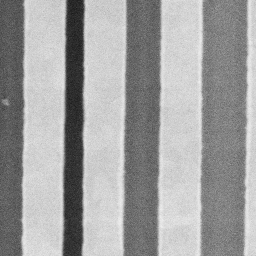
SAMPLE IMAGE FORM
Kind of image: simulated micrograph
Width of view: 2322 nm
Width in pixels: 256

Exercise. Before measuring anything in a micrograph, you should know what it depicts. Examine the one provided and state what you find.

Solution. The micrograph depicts lines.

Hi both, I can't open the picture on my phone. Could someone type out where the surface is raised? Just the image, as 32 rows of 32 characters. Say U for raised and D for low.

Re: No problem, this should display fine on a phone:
DDDUUUUUDDDUUUUUDDDDUUUUUDDDDDDU
DDDUUUUUDDDUUUUUDDDDUUUUUDDDDDDU
DDDUUUUUDDDUUUUUDDDDUUUUUDDDDDDU
DDDUUUUUDDDUUUUUDDDDUUUUUDDDDDDU
DDDUUUUUDDDUUUUUDDDDUUUUUDDDDDDU
DDDUUUUUDDDUUUUUDDDDUUUUUDDDDDDU
DDDUUUUUDDDUUUUUDDDDUUUUUDDDDDDU
DDDUUUUUDDDUUUUUDDDDUUUUUDDDDDDU
DDDUUUUUDDDUUUUUDDDDUUUUUDDDDDDU
DDDUUUUUDDDUUUUUDDDDUUUUUDDDDDDU
DDDUUUUUDDDUUUUUDDDDUUUUUDDDDDDU
DDDUUUUUDDUUUUUUDDDDUUUUUDDDDDDU
DDDUUUUUDDUUUUUUDDDDUUUUUDDDDDDU
DDDUUUUUDDDUUUUUDDDDUUUUUDDDDDDU
DDDUUUUUDDDUUUUDDDDDUUUUUDDDDDDU
DDDUUUUUDDUUUUUDDDDDUUUUUDDDDDDU
DDDUUUUUDDUUUUUDDDDDUUUUUDDDDDDU
DDDUUUUUDDUUUUUDDDDDUUUUUDDDDDDU
DDDUUUUUDDUUUUUDDDDDUUUUUDDDDDDU
DDDUUUUUDDUUUUUDDDDDUUUUUDDDDDDU
DDDUUUUUDDUUUUUDDDDDUUUUUDDDDDDU
DDDUUUUUDDUUUUUDDDDDUUUUUDDDDDDU
DDDUUUUUDDUUUUUDDDDDUUUUUDDDDDDU
DDDUUUUUDDUUUUUDDDDDUUUUUDDDDDDU
DDDUUUUUDDUUUUUDDDDDUUUUUDDDDDDU
DDDUUUUUDDUUUUUDDDDDUUUUUDDDDDDU
DDDUUUUUDDUUUUUDDDDDUUUUUDDDDDDU
DDDUUUUUDDUUUUUDDDDDUUUUUDDDDDDU
DDDUUUUUDDUUUUUDDDDDUUUUUDDDDDDU
DDDUUUUUDDUUUUUDDDDDUUUUUDDDDDDU
DDDUUUUUDDUUUUUDDDDDUUUUUDDDDDDU
DDDUUUUUDDUUUUUDDDDDUUUUUDDDDDDU